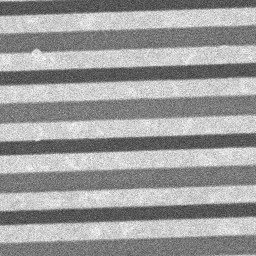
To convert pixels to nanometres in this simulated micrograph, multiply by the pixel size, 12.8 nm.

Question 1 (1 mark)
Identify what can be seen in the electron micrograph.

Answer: parallel lines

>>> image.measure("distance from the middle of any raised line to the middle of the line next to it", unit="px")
34.9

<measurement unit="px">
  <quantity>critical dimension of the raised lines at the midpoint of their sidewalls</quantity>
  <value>18.4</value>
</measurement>